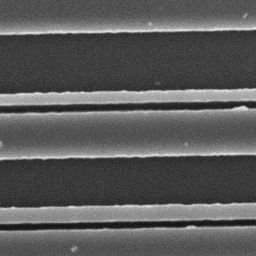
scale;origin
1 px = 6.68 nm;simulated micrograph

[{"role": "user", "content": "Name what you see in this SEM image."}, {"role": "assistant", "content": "lines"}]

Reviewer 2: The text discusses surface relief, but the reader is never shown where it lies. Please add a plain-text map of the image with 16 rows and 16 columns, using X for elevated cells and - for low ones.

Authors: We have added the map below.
XXXXXXXXXXXXXXXX
XXXXXXXXXXXXXXXX
----------------
----------------
----------------
----------------
XXXXXXXXXXXXXXXX
XXXXXXXXXXXXXXXX
XXXXXXXXXXXXXXXX
XXXXXXXXXXXXXXXX
----------------
----------------
----------------
XXXXXXXXXXXXXXXX
XXXXXXXXXXXXXXXX
XXXXXXXXXXXXXXXX